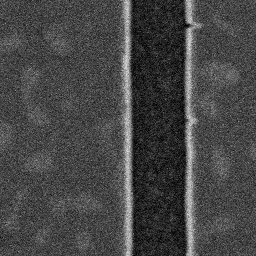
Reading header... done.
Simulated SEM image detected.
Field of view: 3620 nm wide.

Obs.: one or a few lines or trenches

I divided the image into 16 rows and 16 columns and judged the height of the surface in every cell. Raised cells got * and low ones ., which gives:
********....****
********....****
********....****
********....****
********....****
********....****
********....****
********....****
********....****
********....****
********....****
********....****
********....****
********....****
********....****
********....****